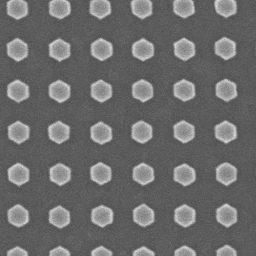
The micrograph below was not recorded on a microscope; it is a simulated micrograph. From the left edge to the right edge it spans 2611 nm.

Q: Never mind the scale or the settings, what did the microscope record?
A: a regular array of raised bodies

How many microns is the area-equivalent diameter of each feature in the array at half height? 0.209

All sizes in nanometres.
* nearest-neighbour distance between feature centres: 420